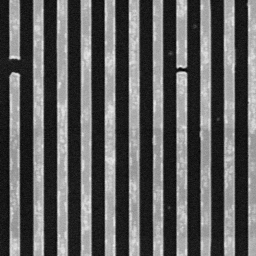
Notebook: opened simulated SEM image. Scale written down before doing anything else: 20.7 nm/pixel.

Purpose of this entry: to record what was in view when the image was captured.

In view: parallel lines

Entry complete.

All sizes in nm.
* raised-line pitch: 494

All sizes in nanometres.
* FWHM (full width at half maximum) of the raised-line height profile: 194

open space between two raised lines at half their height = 290 nm